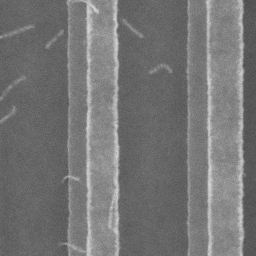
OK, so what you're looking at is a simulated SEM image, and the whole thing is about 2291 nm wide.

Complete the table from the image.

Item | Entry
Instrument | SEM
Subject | lines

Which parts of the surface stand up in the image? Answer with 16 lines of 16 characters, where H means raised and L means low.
LLLLHHHLLLLLHHHL
LLLLHHHLLLLLHHHL
LLLLHHHLLLLLHHHL
LLLLHHHLLLLLHHHL
LLLLHHHLLLLLHHHL
LLLLHHHLLLLLHHHL
LLLLHHHLLLLLHHHL
LLLLHHHLLLLLHHHL
LLLLHHHLLLLLHHHL
LLLLHHHLLLLLHHHL
LLLLHHHLLLLLHHHL
LLLLHHHLLLLLHHHL
LLLLHHHLLLLLHHHL
LLLLHHHLLLLLHHHL
LLLLHHHLLLLLHHHL
LLLLHHHLLLLLHHHL